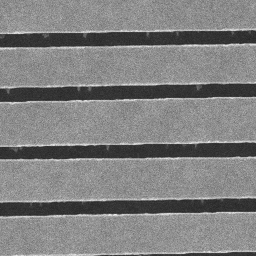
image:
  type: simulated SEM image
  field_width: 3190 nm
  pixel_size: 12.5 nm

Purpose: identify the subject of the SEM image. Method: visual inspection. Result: lines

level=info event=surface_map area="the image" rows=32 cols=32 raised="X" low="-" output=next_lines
XXXXXXXXXXXXXXXXXXXXXXXXXXXXXXXX
XXXXXXXXXXXXXXXXXXXXXXXXXXXXXXXX
XXXXXXXXXXXXXXXXXXXXXXXXXXXXXXXX
XXXXXXXXXXXXXXXXXXXXXXXXXXXXXXXX
--------------------------------
--------------------------------
XXXXXXXXXXXXXXXXXXXXXXXXXXXXXXXX
XXXXXXXXXXXXXXXXXXXXXXXXXXXXXXXX
XXXXXXXXXXXXXXXXXXXXXXXXXXXXXXXX
XXXXXXXXXXXXXXXXXXXXXXXXXXXXXXXX
XXXXXXXXXXXXXXXXXXXX------------
--------------------------------
--------------XXXXXXXXXXXXXXXXXX
XXXXXXXXXXXXXXXXXXXXXXXXXXXXXXXX
XXXXXXXXXXXXXXXXXXXXXXXXXXXXXXXX
XXXXXXXXXXXXXXXXXXXXXXXXXXXXXXXX
XXXXXXXXXXXXXXXXXXXXXXXXXXXXXXXX
XXXXXXXXXXXXXXXXXXXXXXXXXXXXXXXX
--------------------------------
--------------------------------
XXXXXXXXXXXXXXXXXXXXXXXXXXXXXXXX
XXXXXXXXXXXXXXXXXXXXXXXXXXXXXXXX
XXXXXXXXXXXXXXXXXXXXXXXXXXXXXXXX
XXXXXXXXXXXXXXXXXXXXXXXXXXXXXXXX
XXXXXXXXXXXXXXXXXXXXXXXXXXXXXXXX
--------------------------------
--------------------------------
XXXXXXXXXXXXXXXXXXXXXXXXXXXXXXXX
XXXXXXXXXXXXXXXXXXXXXXXXXXXXXXXX
XXXXXXXXXXXXXXXXXXXXXXXXXXXXXXXX
XXXXXXXXXXXXXXXXXXXXXXXXXXXXXXXX
XXXXXXXXXXXXXXXXXXXXXXXXXXXXX---